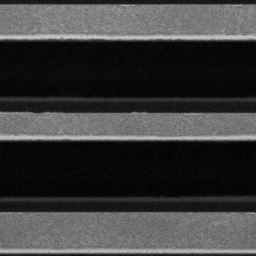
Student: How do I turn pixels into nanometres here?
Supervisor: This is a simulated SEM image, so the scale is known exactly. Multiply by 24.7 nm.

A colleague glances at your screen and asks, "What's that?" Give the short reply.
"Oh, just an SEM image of lines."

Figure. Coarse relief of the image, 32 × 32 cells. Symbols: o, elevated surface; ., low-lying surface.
................................
oooooooooooooooooooooooooooooooo
oooooooooooooooooooooooooooooooo
oooooooooooooooooooooooooooooooo
oooooooooooooooooooooooooooooooo
................................
................................
................................
................................
................................
................................
................................
................................
................................
oooooooooooooooooooooooooooooooo
oooooooooooooooooooooooooooooooo
oooooooooooooooooooooooooooooooo
................................
................................
................................
................................
................................
................................
................................
................................
................................
................................
oooooooooooooooooooooooooooooooo
oooooooooooooooooooooooooooooooo
oooooooooooooooooooooooooooooooo
oooooooooooooooooooooooooooooooo
oooooooooooooooooooooooooooooooo